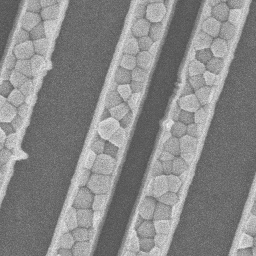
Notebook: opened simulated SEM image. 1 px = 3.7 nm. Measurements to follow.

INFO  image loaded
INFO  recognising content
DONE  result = one or a few lines or trenches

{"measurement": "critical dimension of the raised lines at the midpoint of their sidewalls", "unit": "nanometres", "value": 150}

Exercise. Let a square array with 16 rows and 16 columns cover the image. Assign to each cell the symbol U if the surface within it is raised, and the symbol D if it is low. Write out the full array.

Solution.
DUUUDDDDUUUDDUUD
DUUUDDDDUUDDUUUD
DUUDDDDDUUDDUUUD
UUUDDDDUUUDDUUDD
UUUDDDDUUDDUUUDD
UUDDDDDUUDDUUUDD
UUDDDDUUUDDUUDDD
UUDDDDUUDDUUUDDD
UDDDDDUUDDUUUDDD
UDDDDUUUDDUUDDDD
UDDDDUUDDUUUDDDD
DDDDDUUDDUUUDDDD
DDDDUUUDDUUDDDDD
DDDDUUDDUUUDDDDU
DDDDUUDDUUUDDDDU
DDDUUUDDUUDDDDDU